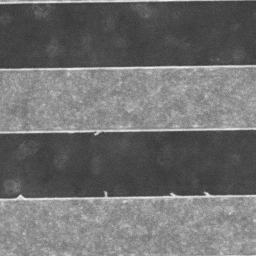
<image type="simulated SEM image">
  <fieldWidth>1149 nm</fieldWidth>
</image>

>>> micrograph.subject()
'one or a few lines or trenches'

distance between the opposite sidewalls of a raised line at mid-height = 283 nanometres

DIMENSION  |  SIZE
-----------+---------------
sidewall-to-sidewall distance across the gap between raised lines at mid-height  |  301 nm